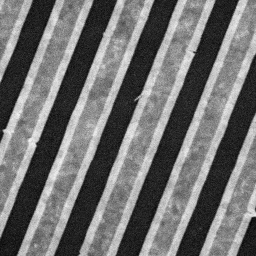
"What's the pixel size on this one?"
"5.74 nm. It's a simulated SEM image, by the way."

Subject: parallel lines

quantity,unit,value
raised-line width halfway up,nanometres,151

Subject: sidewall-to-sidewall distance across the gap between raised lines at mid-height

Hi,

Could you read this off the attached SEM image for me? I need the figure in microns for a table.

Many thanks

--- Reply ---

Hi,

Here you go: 0.171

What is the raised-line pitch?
325 nanometres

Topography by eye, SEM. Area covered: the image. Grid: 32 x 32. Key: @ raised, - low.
@@@----@@@@----@@@-----@@@----@@
@@@----@@@@----@@@----@@@@----@@
@@@----@@@----@@@@----@@@----@@@
@@----@@@@----@@@-----@@@----@@@
@@----@@@----@@@@----@@@@----@@@
@----@@@@----@@@@----@@@----@@@@
@----@@@@----@@@----@@@@----@@@-
@----@@@----@@@@----@@@-----@@@-
----@@@@----@@@----@@@@----@@@@-
----@@@----@@@@----@@@@----@@@--
----@@@----@@@@----@@@----@@@@--
---@@@@----@@@----@@@@----@@@---
---@@@----@@@@----@@@-----@@@---
--@@@@----@@@-----@@@----@@@@---
--@@@----@@@@----@@@@----@@@----
--@@@----@@@@----@@@----@@@@----
-@@@@----@@@----@@@@----@@@@----
-@@@----@@@@----@@@-----@@@----@
@@@@----@@@@----@@@----@@@@----@
@@@-----@@@----@@@@----@@@----@@
@@@----@@@@----@@@----@@@@----@@
@@@----@@@----@@@@----@@@@----@@
@@----@@@@----@@@@----@@@----@@@
@@----@@@@----@@@----@@@@----@@@
@@----@@@----@@@@----@@@----@@@@
@----@@@@----@@@----@@@@----@@@@
@----@@@----@@@@----@@@@----@@@@
----@@@@----@@@@----@@@----@@@@-
----@@@-----@@@----@@@@----@@@--
----@@@----@@@@----@@@----@@@@--
---@@@@----@@@-----@@@----@@@@--
---@@@-----@@@----@@@@----@@@---